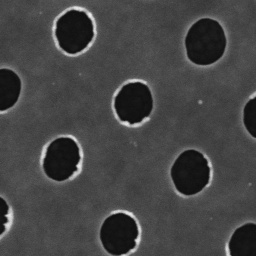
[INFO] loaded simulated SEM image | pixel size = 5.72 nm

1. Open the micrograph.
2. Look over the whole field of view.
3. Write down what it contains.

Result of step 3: holes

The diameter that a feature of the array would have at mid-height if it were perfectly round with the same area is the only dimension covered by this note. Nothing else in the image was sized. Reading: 228 nanometers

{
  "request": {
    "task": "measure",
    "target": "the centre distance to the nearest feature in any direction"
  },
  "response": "524 nm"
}